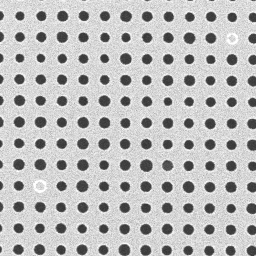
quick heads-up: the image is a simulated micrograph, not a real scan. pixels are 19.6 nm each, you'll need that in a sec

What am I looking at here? a regular array of holes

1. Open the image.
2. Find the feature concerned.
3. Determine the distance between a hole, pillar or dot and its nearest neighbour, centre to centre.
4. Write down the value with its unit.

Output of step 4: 412 nm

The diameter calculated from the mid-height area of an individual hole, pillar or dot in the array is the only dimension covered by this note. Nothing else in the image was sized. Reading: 210 nm